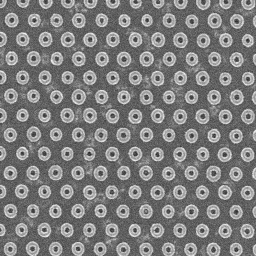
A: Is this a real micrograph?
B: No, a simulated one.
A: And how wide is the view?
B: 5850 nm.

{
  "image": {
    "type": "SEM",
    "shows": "a regular array of ring-shaped raised bodies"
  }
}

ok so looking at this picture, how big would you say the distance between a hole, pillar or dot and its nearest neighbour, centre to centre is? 21.8 pixels